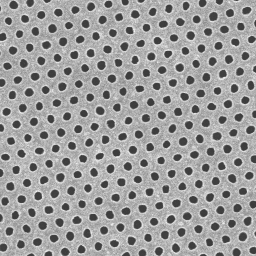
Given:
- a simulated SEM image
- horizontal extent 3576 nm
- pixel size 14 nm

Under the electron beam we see a regular array of holes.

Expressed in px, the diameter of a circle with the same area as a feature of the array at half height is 7.9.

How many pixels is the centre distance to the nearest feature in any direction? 16.5